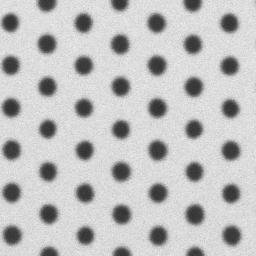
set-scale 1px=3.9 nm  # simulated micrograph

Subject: a regular array of holes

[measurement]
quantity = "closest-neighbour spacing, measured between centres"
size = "164 nm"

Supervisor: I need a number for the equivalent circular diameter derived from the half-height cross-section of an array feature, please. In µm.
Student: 0.0732